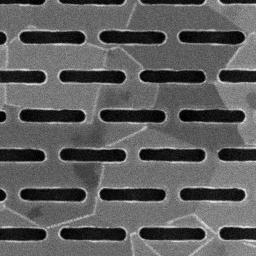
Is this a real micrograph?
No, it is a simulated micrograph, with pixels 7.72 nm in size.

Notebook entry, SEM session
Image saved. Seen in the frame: a regular array of holes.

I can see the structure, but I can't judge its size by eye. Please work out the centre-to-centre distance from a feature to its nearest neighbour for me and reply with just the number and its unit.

431 nanometers